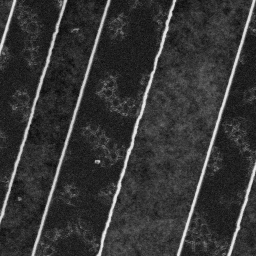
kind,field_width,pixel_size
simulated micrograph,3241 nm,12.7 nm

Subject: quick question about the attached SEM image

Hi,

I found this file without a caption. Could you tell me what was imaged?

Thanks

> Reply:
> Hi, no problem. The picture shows one or a few lines or trenches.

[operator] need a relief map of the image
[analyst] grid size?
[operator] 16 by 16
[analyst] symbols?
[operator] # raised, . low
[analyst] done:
.###...####.....
####..#####....#
###...####.....#
###...####.....#
###..#####.....#
##...####.....##
##...####.....##
##...####.....##
##..####.....###
#...####.....###
#...####.....###
#..#####....####
...####.....###.
...####.....###.
..#####.....###.
..####.....###..